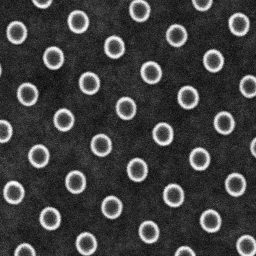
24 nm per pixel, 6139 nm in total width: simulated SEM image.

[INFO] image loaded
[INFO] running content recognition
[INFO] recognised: a regular array of raised bodies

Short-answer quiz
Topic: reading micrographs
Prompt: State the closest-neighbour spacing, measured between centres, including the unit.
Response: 1050 nanometers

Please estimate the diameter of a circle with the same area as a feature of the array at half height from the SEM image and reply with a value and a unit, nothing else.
471 nm